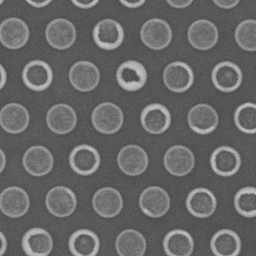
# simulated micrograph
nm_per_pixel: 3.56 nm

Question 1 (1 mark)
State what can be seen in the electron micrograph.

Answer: a regular array of raised bodies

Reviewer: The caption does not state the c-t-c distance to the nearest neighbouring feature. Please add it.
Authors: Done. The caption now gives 166 nm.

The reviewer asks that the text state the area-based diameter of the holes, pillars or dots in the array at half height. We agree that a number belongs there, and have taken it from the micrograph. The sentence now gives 0.105 micrometres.